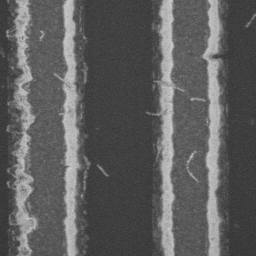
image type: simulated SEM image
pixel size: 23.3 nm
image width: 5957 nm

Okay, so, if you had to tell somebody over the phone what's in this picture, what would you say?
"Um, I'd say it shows one or a few lines or trenches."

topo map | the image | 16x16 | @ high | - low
-@@@------@@@---
-@@@------@@@---
-@@@------@@@---
-@@@------@@@---
--@@@-----@@@---
-@@@------@@@---
--@@------@@@---
--@@------@@@---
-@@@------@@@---
-@@@------@@@---
-@@@@-----@@@---
-@@@------@@@---
-@@@-------@@---
-@@@------@@@---
--@@------@@@---
-@@@-------@@---